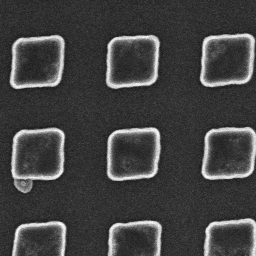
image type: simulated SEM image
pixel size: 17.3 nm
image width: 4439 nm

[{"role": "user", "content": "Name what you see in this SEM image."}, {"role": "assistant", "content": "raised bodies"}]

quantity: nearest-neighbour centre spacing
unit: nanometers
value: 1620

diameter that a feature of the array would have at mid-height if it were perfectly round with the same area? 935 nm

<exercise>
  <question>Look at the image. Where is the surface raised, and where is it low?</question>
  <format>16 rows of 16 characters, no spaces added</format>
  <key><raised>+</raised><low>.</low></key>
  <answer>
................
................
..++...+++...+++
.+++...+++...+++
.+++...+++...+++
................
................
................
.+++...+++...+++
.+++...+++...+++
.+++...+++...+++
................
................
................
.+++...+++...+++
.+++...+++...+++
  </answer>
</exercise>